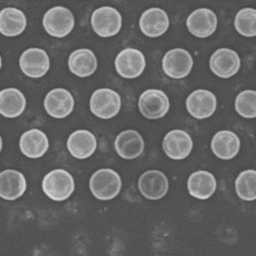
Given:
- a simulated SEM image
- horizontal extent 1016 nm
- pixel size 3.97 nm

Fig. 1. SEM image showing a regular array of raised bodies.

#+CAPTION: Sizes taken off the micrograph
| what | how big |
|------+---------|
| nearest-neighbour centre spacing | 186 nm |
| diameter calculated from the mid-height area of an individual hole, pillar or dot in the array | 0.112 micrometres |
